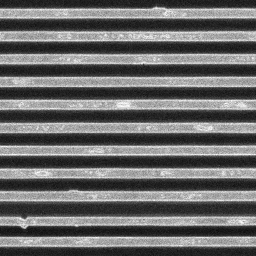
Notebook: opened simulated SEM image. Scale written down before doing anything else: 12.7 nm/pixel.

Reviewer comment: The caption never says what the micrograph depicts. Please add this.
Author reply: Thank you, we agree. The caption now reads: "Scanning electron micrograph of parallel lines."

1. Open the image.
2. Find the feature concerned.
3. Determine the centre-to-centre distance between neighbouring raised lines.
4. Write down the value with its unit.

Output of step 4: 290 nm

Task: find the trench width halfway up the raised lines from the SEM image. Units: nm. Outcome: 141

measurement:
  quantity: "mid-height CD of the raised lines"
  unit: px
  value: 12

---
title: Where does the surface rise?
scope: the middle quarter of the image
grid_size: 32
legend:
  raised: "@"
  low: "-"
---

--------------------------------
--------------------------------
--------------------------------
@@@@@@@@@@@@@@@@@@@@@@@@@@@@@@@@
@@@@@@@@@@@@@@@@@@@@@@@@@@@@@@@@
@@@@@@@@@@@@@@@@@@@@@@@@@@@@@@@@
--------------------------------
--------------------------------
--------------------------------
@@@@@@@@@@@@@@@@@@@@@@@@@@@@@@@@
@@@@@@@@@@@@@@@@@@@@@@@@@@@@@@@@
@@@@@@@@@@@@@@@@--------------@@
--------------------------------
--------------------------------
--------------------------------
@@@@@@@@@@@@@@@@@@@@@@@@@@@@@@@@
@@@@@@@@@@@@@@@@@@@@@@@@@@@@@@@@
--------------------------------
--------------------------------
--------------------------------
@@@@@@@@@@@@@@@@@@@@@@@@@@@@@@@@
@@@@@@@@@@@@@@@@@@@@@@@@@@@@@@@@
@@@@@@@@@@@@@@@@@@@@@@@@@@@@@@@@
--------------------------------
--------------------------------
--------------------------------
@@@@@@@@@@@@@@@@@@@@@@@@@@@@@@@@
@@@@@@@@@@@@@@@@@@@@@@@@@@@@@@@@
@@@@@@@@@@@@@@@@@@@@@@@@@@@@@@@@
--------------------------------
--------------------------------
-@@@----------------------------